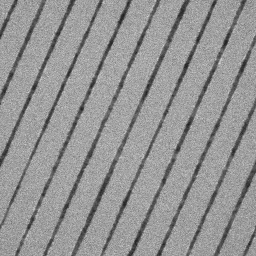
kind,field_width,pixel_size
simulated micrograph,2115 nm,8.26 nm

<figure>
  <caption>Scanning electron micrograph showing parallel lines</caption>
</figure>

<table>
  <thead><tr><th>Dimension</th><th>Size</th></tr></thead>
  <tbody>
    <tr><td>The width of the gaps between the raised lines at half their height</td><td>177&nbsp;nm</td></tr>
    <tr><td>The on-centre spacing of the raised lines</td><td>215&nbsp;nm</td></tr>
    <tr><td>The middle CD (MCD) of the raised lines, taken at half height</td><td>38.6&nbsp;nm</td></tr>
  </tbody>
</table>